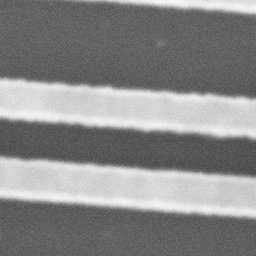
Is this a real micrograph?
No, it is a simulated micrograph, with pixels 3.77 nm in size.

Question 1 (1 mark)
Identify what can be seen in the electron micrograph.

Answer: lines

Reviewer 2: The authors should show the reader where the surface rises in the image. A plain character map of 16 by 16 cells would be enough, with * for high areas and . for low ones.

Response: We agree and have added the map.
..............**
................
................
................
................
******..........
****************
....************
................
................
*******.........
****************
.....***********
................
................
................